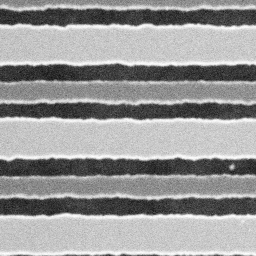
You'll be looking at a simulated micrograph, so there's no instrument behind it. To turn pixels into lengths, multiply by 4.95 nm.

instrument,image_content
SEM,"lines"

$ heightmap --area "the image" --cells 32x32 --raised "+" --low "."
++++++++++++++++++++++++++++++++
................................
................................
++++++++++++++++++++++++++++++++
++++++++++++++++++++++++++++++++
++++++++++++++++++++++++++++++++
++++++++++++++++++++++++++++++++
++++++++++++++++++++++++++++++++
................................
................................
++++++++++++++++++++++++++++++++
++++++++++++++++++++++++++++++++
++++++++++++++++++++++++++++++++
................................
................................
++++++++++++++++++++++++++++++++
++++++++++++++++++++++++++++++++
++++++++++++++++++++++++++++++++
++++++++++++++++++++++++++++++++
++++++++++++++++++++++++++++++++
................................
................................
++++++++++++++++++++++++++++++++
++++++++++++++++++++++++++++++++
++++++++++++++++++++++++++++++++
................................
................................
++++++++++++++++++++++++++++++++
++++++++++++++++++++++++++++++++
++++++++++++++++++++++++++++++++
++++++++++++++++++++++++++++++++
++++++++++++++++++++++++++++++++